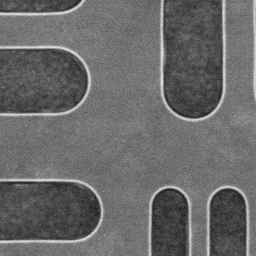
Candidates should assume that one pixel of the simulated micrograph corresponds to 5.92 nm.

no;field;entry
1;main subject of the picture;groups of lines, slits or small figures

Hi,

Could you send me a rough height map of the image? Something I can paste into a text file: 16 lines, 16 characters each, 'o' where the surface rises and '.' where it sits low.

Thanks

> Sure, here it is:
.....ooooo....oo
oooooooooo....oo
oooooooooo....oo
.....ooooo....oo
.....ooooo....oo
.....ooooo....oo
.....ooooo....oo
oooooooooooooooo
oooooooooooooooo
oooooooooooooooo
oooooooooooooooo
.....ooooooooooo
......oooo..o..o
......ooo...o..o
......ooo...o..o
ooooooooo...o..o